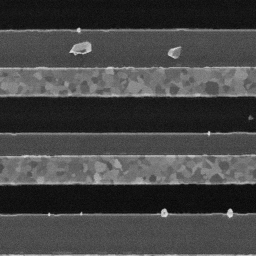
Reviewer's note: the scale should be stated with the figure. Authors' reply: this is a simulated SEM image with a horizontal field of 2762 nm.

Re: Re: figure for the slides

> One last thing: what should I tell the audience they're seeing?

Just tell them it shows lines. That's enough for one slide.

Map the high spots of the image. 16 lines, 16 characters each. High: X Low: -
----------------
----------------
XXXXXXXXXXXXXXXX
XXXXXXXXXXXXXXXX
XXXXXXXXXXXXXXXX
XXXXXXXXXXXXXXXX
----------------
----------------
XXXXXXXXXXXXXXXX
XXXXXXXXXXXXXXXX
XXXXXXXXXXXXXXXX
XX--------------
----------------
XXXXXXXXXXXXXXXX
XXXXXXXXXXXXXXXX
XXXXXXXXXXXXXXXX